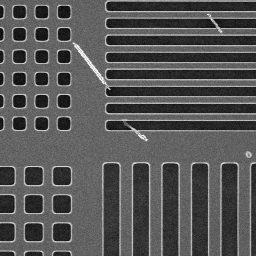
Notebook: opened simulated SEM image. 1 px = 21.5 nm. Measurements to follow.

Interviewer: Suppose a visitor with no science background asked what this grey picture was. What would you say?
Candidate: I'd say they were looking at groups of lines, slits or small figures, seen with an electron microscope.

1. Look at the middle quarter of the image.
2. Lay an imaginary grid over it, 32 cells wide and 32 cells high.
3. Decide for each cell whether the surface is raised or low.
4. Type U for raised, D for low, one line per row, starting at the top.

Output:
UUUUUUUUUUUUUUUUUUUUUUUUUUUUUUUU
UUUUUUUUUUUDDDDDDDDDDDDDDDDDDDDD
DUUUUUUUUUDDDDDDDDDDDDDDDDDDDDDD
DDUUUUUUUUUDDDDDDDDDDDDDDDDDDDDD
DDUUUUUUUUUUUUUUUUUUUUUUUUUUUUUU
UUUUUUUUUUUUUUUUUUUUUUUUUUUUUUUU
UUUUUUUUUUDDDDDDDDDDDDDDDDDDDDDD
UUUUUUUUUUUDDDDDDDDDDDDDDDDDDDDD
DDUUUUUUUUUUUUUUUUUUUUUUUUUUUUUU
DDUUUUUUUUUUUUUUUUUUUUUUUUUUUUUU
DUUUUUUUUUUDDDDDDDDDDDDDDDDDDDDD
UUUUUUUUUUDDDDDDDDDDDDDDDDDDDDDD
UUUUUUUUUUUDDDDDDDDDDDDDDDDDDDDD
DUUUUUUUUUUUUUUUUUUUUUUUUUUUUUUU
DDUUUUUUUUUDDDDDDDDDDDDDDDDDDDDD
DDUUUUUUUUDDDDDDDDDDDDDDDDDDDDDD
DUUUUUUUUUUDDDDDUUDDDDDDDDDDDDDD
UUUUUUUUUUUUUUUUUUUUUUUUUUUUUUUU
UUUUUUUUUUUUUUUUUUUUUUUUUUUUUUUU
UUUUUUUUUUUUUUUUUUUUUUUUUUUUUUUU
UUUUUUUUUUUUUUUUUUUUUUUUUUUUUUUU
UUUUUUUUUUUUUUUUUUUUUUUUUUUUUUUU
UUUUUUUUUUUUUUUUUUUUUUUUUUUUUUUU
UUUUUUUUUUUUUUUUUUUUUUUUUUUUUUUU
UUUUUUUUUUUUUUUUUUUUUUUUUUUUUUUU
UUUUUUUUUUDDDDUUUDDDDUUUUDDDDUUU
DDUUUUUUUUDDDDUUUDDDDUUUDDDDDUUU
DDUUUUUUUUDDDDUUUDDDDUUUDDDDDUUU
DDUUUUUUUUDDDDUUUDDDDUUUDDDDDUUU
DDUUUUUUUUDDDDUUUDDDDUUUDDDDDUUU
UUUUUUUUUUDDDDUUUDDDDUUUDDDDDUUU
UUUUUUUUUUDDDDUUUDDDDUUUDDDDDUUU